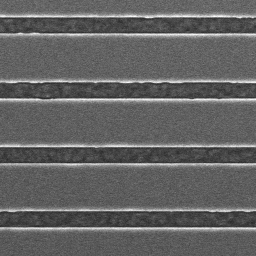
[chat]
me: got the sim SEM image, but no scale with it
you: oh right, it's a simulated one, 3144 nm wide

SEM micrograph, lines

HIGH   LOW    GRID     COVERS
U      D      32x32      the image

UUUUUUUUUUUUUUUUUUUUUUUUUUUUUUUU
UUUUUUUUUUUUUUUUUUUUUUUUUUUUUUUU
DDDDDDDDDDDDDDDDDDDDDDDDDDDDDDDD
DDDDDDDDDDDDDDDDDDDDDDDDDDDDDDDD
UUUUUUUUUUUUUUUUUUUUUUUUUUUUUUUU
UUUUUUUUUUUUUUUUUUUUUUUUUUUUUUUU
UUUUUUUUUUUUUUUUUUUUUUUUUUUUUUUU
UUUUUUUUUUUUUUUUUUUUUUUUUUUUUUUU
UUUUUUUUUUUUUUUUUUUUUUUUUUUUUUUU
UUUUUUUUUUUUUUUUUUUUUUUUUUUUUUUU
DDDDDDDDDDDDDDDDDDDDDDDDDDDDDDDD
DDDDDDDDDDDDDDDDDDDDDDDDDDDDDDDD
UUUUUDDUUUUUUUUUUUUUUUUUUUUUUUUU
UUUUUUUUUUUUUUUUUUUUUUUUUUUUUUUU
UUUUUUUUUUUUUUUUUUUUUUUUUUUUUUUU
UUUUUUUUUUUUUUUUUUUUUUUUUUUUUUUU
UUUUUUUUUUUUUUUUUUUUUUUUUUUUUUUU
UUUUUUUUUUUUUUUUUUUUUUUUUUUUUUUU
DDDDDDDDDDDDDDDDDDDDDDDDDDDDDDDD
DDDDDDDDDDDDDDDDDDDDDDDDDDDDDDDD
DDDDDDDDDDDDDDDDDDDDDDDDDDDDDDDD
UUUUUUUUUUUUUUUUUUUUUUUUUUUUUUUU
UUUUUUUUUUUUUUUUUUUUUUUUUUUUUUUU
UUUUUUUUUUUUUUUUUUUUUUUUUUUUUUUU
UUUUUUUUUUUUUUUUUUUUUUUUUUUUUUUU
UUUUUUUUUUUUUUUUUUUUUUUUUUUUUUUU
DDDDDDDDDDDDDDDDDDDDDDDDDDDDDDDD
DDDDDDDDDDDDDDDDDDDDDDDDDDDDDDDD
DDDDDDDDDDDDDDDDDDDDDDDDDDDDDDDD
UUUUUUUUUUUUUUUUUUUUUUUUUUUUUUUU
UUUUUUUUUUUUUUUUUUUUUUUUUUUUUUUU
UUUUUUUUUUUUUUUUUUUUUUUUUUUUUUUU